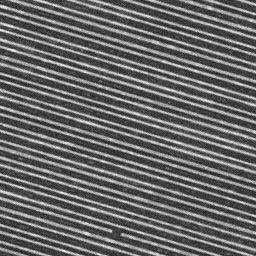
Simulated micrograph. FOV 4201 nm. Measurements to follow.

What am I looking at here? parallel lines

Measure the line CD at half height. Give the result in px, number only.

1.91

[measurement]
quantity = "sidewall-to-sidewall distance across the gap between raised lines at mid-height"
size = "0.0767 micrometres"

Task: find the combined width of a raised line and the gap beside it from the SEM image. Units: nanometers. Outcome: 132